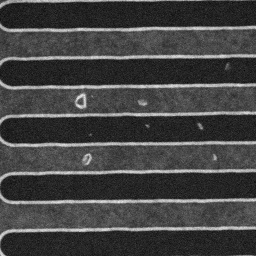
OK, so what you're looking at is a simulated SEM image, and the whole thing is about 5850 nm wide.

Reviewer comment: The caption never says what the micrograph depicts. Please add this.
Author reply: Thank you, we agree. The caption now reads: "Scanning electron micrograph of groups of lines, slits or small figures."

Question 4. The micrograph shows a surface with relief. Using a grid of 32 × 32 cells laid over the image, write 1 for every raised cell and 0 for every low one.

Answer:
00000000000000000000000000000000
00000000000000000000000000000000
00000000000000000000000000000000
00000000000000000000000000000001
11111111111111111111111111111111
11111111111111111111111111111111
11111111111111111111111111111111
10000000000000000000000000000000
00000000000000000000000000000000
00000000000000000000000000000000
00000000000000000000000000000000
11111111111111111111111111111111
11111111111111111111111111111111
11111111111111111111111111111111
11100000000000000000000000000000
00000000000000000000000000000000
00000000000000000000000000000000
00000000000000000000000000000000
11111111111111111111111111111111
11111111111111111111111111111111
11111111111111111111111111111111
11111111111111000000000000000000
00000000000000000000000000000000
00000000000000000000000000000000
00000000000000000000000000000000
11111111111111111111111111111111
11111111111111111111111111111111
11111111111111111111111111111111
11111111111111111111111111110000
00000000000000000000000000000000
00000000000000000000000000000000
00000000000000000000000000000000